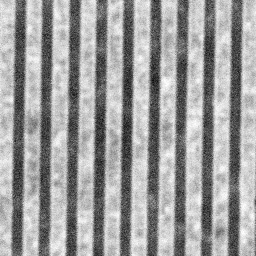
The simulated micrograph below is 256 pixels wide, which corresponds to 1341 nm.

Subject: parallel lines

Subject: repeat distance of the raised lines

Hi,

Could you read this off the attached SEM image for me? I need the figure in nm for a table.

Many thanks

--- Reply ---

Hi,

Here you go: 142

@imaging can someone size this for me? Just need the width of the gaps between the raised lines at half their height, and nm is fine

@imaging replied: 66.2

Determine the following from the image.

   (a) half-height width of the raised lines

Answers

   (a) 76 nm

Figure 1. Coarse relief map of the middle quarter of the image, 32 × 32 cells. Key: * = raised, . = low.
*...****...***....***....***...*
*...****...***....***....***...*
*...****...***....***....***...*
*...****...***....***....***...*
*...****...***....***...****...*
*...****...***....***...****...*
*...****...***....***...****...*
*...****...***....***...****...*
*...****...***....***...****...*
*...****...***....***...****...*
*...***....***....***...****...*
*...***....***....***...****...*
*...***....***....***...****...*
*...***....***....***...****...*
*...***....***....***...***....*
*...***....***....***...***....*
*...***....***....***...****...*
*...***....***....***...****...*
*...***....***....***...****...*
*...***....***....***...****...*
*...***....***...****...****...*
*...***....***...****...****...*
*...***....***...****...****...*
*...***....***...****...****...*
*.....*....***...****...****...*
*...***....***...****...****...*
....***....***...****...****...*
....***....***...****...****...*
....***....***...****...****...*
....***....***...***....****...*
....***....***...***....***....*
....***....***...***....***....*